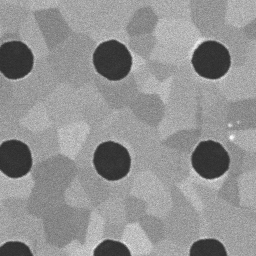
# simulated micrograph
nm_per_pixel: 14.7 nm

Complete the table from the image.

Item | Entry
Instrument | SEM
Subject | holes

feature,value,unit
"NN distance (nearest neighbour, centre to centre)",1450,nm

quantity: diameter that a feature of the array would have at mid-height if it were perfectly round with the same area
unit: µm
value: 0.577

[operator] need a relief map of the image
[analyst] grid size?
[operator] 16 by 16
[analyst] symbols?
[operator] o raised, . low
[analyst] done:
oooooooooooooooo
oooooooooooooooo
oooooooooooooooo
..oooo..oooo..oo
..oooo..oooo..oo
oooooooooooooooo
oooooooooooooooo
oooooooooooooooo
oooooooooooooooo
..oooo..oooo..oo
..oooo..oooo..oo
oooooooooooooooo
oooooooooooooooo
oooooooooooooooo
oooooooooooooooo
..oooo..oooo..oo